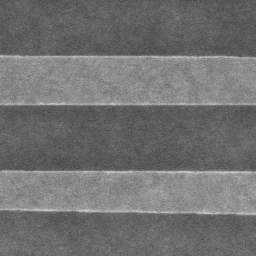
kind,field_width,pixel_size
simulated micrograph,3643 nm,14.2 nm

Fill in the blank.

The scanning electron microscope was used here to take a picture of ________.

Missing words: lines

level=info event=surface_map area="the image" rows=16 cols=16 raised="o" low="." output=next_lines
................
................
................
................
oooooooooooooooo
oooooooooooooooo
oooooooooooooooo
................
................
................
................
oooooooooooooooo
oooooooooooooooo
................
................
................